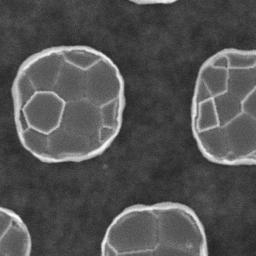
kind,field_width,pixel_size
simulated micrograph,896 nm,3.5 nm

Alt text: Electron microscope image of raised bodies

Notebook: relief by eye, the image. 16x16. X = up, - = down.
----------------
----------------
----------------
--XXXXX------XXX
-XXXXXX------XXX
-XXXXXXX----XXXX
-XXXXXXX----XXXX
-XXXXXXX----XXXX
-XXXXXX-----XXXX
--XXXX-------XXX
----------------
----------------
----------------
X------XXXXX----
XX-----XXXXXX---
XX----XXXXXXX---